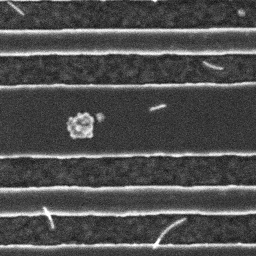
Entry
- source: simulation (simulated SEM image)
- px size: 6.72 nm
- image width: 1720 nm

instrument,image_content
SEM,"lines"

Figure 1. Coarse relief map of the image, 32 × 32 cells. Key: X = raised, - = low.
--------------------------------
--------------------------------
--------------------------------
--------------------------------
XXXXXXXXXXXXXXXXXXXXXXXXXXXXXXXX
XXXXXXXXXXXXXXXXXXXXXXXXXXXXXXXX
XXXXXXXXXXXXXXXXXXXXXXXXXXXXXXXX
--------------------------------
--------------------------------
--------------------------------
-----------------------XXXX--XXX
XXXXXXXXXXXXXXXXXXXXXXXXXXXXXXXX
XXXXXXXXXXXXXXXXXXXXXXXXXXXXXXXX
XXXXXXXXXXXXXXXXXXXXXXXXXXXXXXXX
XXXXXXXXXXXXXXXXXXXXXXXXXXXXXXXX
XXXXXXXXXXXXXXXXXXXXXXXXXXXXXXXX
XXXXXXXXXXXXXXXXXXXXXXXXXXXXXXXX
XXXXXXXXXXXXXXXXXXXXXXXXXXXXXXXX
XXXXXXXXXXXXXXXXXXXXXXXXXXXXXXXX
XXXXXXXXXXXXXXXXX-X--XX---------
--------------------------------
--------------------------------
--------------------------------
-----XXXXXXX-XXXXXXXXXXXXXXXXXXX
XXXXXXXXXXXXXXXXXXXXXXXXXXXXXXXX
XXXXXXXXXXXXXXXXXXXXXXXXXXXXXXXX
XXXXXXXXXXXXXXXXXXXXXXXXXXXXXXXX
--------------------------------
--------------------------------
--------------------------------
-------------------X---------X--
XXXXXXXXXXXXXXXXXXXXXXXXXXXXXXXX